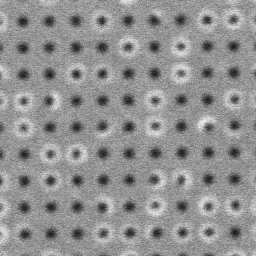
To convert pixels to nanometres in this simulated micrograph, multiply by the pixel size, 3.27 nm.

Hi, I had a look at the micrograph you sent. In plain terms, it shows a regular array of holes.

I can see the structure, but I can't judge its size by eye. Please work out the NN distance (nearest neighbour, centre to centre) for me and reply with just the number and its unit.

85.5 nanometers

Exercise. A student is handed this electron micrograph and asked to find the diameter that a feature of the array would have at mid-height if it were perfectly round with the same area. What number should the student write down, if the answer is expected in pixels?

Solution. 11.1